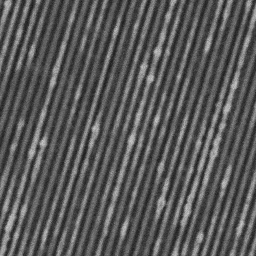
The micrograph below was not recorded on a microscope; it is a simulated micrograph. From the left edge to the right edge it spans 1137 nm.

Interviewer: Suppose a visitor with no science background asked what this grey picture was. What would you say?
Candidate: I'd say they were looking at parallel lines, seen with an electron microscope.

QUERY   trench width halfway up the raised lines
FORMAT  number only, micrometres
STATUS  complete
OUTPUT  0.0256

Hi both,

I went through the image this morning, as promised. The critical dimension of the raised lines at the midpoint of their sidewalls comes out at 0.017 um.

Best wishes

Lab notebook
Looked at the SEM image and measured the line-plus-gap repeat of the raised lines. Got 41 nm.